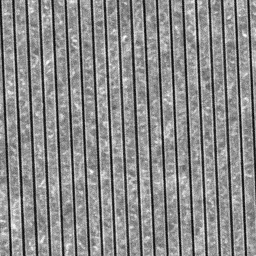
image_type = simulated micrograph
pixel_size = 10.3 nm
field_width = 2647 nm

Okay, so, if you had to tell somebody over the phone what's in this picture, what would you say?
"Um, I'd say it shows parallel lines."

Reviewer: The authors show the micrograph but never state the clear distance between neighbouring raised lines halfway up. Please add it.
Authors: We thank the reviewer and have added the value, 0.0336 microns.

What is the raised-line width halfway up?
101 nanometers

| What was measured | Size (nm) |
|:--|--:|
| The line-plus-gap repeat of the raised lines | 135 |